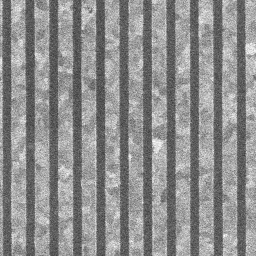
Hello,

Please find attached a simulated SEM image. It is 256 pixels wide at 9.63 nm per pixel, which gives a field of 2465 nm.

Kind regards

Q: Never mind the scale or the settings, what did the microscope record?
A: parallel lines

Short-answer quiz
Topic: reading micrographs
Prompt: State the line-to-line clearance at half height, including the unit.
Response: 93.9 nm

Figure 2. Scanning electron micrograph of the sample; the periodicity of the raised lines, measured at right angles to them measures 23.5 pixels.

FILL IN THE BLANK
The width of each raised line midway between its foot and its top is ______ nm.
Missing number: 132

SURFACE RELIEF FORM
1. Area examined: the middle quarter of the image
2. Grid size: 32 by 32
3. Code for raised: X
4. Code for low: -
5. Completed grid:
-X---XXX--XXXX--XXXX--X-X---XXX-
-X---XXX--XXXX--XXXX--XXX---XXX-
XX---XXX--XXXX--XXXX--XXX---XXX-
XX---XXX--X-XX--XXXX--XXX---XXX-
XX---XXX--XXXX--XXXX--XXX---XXX-
XX---XXX---XXX--XX-X--XXX---XXX-
XX---XXX--XXXX--XXX---XXX---XXX-
XX---XXX--XXXX--X-----XXX---XXX-
XX---XXX--XXXX--X--X--XXX---XXX-
XX---XXX--XXXX--XXXX--XXX---XXX-
XX---XXX--XXXX--XXXX--XXX---XXX-
XX---XXX--XXXX--XXXX--XXX---XXX-
XX---XXX--XXXX--XXXX--XXX---XXX-
XX---XXX--XXXX--XXXX---XX---XXX-
XX---XXX--XXXX--XXXX----XX--XXX-
XX---XXX--XXXX--XXXX--XXX---XXX-
XX---XXX--XXXX--XXXX--XXX---XX--
XX---XXX--XXXX--XXXX--XXX---XXX-
XX---XXX--XXXX--XXXX--XXX---XXX-
XX---XXX---XXX--XXXX--XXX---XXX-
XX---XXX---XXX--XXXX--XXX---XXX-
XX---XXX---XXX--XXXX--XXX---XXX-
XX---XXX---XXX--XXXX--XXX---XXX-
XX---XXX---XXX--XXXX--XXX---XXX-
XX---XXX---XXX--XXXX--XXX---XXX-
XX---XXX---XXX--XXXX--XXX-----X-
XX---XXX---XX---XXXX--XXX---XXX-
XX---XXX---X----XXXX--XXX---XXX-
XX---XXX---XX---XXXX--XXX---XXX-
XX--XXXX---XXX--XXXX--XXX---XXX-
XX---XXX---XXX--XXXX--XXX---XXX-
XX---XXX--XXXX--XXXX--XXX---XXX-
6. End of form